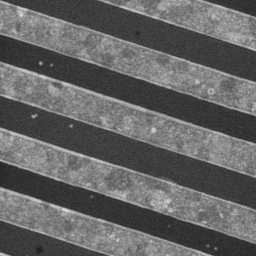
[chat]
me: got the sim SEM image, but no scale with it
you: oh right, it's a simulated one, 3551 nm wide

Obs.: lines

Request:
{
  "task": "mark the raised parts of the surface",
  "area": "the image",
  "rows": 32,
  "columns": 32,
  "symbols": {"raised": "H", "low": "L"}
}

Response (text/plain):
HLLLLLLLLLLLLLHHHHHHHHHHHHHLLLLL
HHHHHLLLLLLLLLLLLHHHHHHHHHHHHHLL
HHHHHHHHLLLLLLLLLLLLHHHHHHHHHHHH
HHHHHHHHHHHLLLLLLLLLLLLHHHHHHHHH
LHHHHHHHHHHHHHLLLLLLLLLLLLHHHHHH
LLLLHHHHHHHHHHHHHLLLLLLLLLLLLHHH
LLLLLLLHHHHHHHHHHHHHLLLLLLLLLLLL
LLLLLLLLLLHHHHHHHHHHHHHLLLLLLLLL
HHLLLLLLLLLLLHHHHHHHHHHHHHLLLLLL
HHHHHHLLLLLLLLLLHHHHHHHHHHHHHLLL
HHHHHHHHHLLLLLLLLLLLHHHHHHHHHHHH
HHHHHHHHHHHHLLLLLLLLLLHHHHHHHHHH
LLHHHHHHHHHHHHHLLLLLLLLLLLHHHHHH
LLLLLHHHHHHHHHHHHHLLLLLLLLLLLHHH
LLLLLLLLHHHHHHHHHHHHHLLLLLLLLLLL
LLLLLLLLLLLHHHHHHHHHHHHHLLLLLLLL
HHLLLLLLLLLLLLHHHHHHHHHHHHHLLLLL
HHHHHLLLLLLLLLLLLHHHHHHHHHHHHHLL
HHHHHHHHLLLLLLLLLLLLHHHHHHHHHHHH
HHHHHHHHHHHLLLLLLLLLLLLHHHHHHHHH
LHHHHHHHHHHHHHLLLLLLLLLLLLLHHHHH
LLLLHHHHHHHHHHHHHLLLLLLLLLLLLLHH
LLLLLLLHHHHHHHHHHHHHLLLLLLLLLLLL
LLLLLLLLLLHHHHHHHHHHHHHLLLLLLLLL
HHHHLLLLLLLLLLHHHHHHHHHHHHHLLLLL
HHHHHHLLLLLLLLLLLHHHHHHHHHHHHLLL
HHHHHHHHHHLLLLLLLLLLHHHHHHHHHHHH
HHHHHHHHHHHHHLLLLLLLLLLHHHHHHHHH
LLLHHHHHHHHHHHHHLLLLLLLLLLHHHHHH
LLLLLLHHHHHHHHHHHHHLLLLLLLLLLHHH
LLLLLLLLLHHHHHHHHHHHHHLLLLLLLLLL
LLLLLLLLLLLLHHHHHHHHHHHHHLLLLLLL